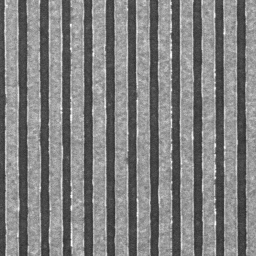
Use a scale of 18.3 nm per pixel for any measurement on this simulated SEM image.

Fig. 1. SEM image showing parallel lines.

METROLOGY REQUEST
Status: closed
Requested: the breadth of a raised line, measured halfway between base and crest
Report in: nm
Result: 229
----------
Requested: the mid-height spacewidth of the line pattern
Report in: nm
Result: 165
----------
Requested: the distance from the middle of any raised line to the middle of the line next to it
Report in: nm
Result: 400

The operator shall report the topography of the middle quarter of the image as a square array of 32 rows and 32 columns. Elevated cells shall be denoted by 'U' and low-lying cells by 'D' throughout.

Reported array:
DDUUUDDUUUDDDUUUDDUUUDDDUUUDDUUU
DDUUUDDUUUDDDUUUDDUUUDDDUUUDDUUU
DDUUUDDUUUDDDUUUDDUUUDDDUUUDDUUU
DDUUUDDUUUDDDUUUDDUUUDDDUUUDDUUU
DDUUUDDUUUDDDUUUDDUUUDDDUUUDDUUU
DDUUUDDUUUDDDUUUDDUUUDDDUUUDDUUU
DDUUUDDUUUDDDUUUDDUUUDDDUUUDDUUU
DDUUUDDUUUDDDUUUDDUUUDDDUUUDDUUU
DDUUUDDUUUDDDUUUDDUUUDDDUUUDDUUU
DDUUUDDUUUDDDUUUDDUUUDDDUUUDDUUU
DDUUUDDUUUDDDUUUDDUUUDDDUUUDDUUU
DDUUUDDUUUDDDUUUDDUUUDDDUUUDDUUU
DDUUUDDUUUDDDUUUDDUUUDDDUUUDDUUU
DDUUUDDUUUDDDUUUDDUUUDDDUUUDDUUU
DDUUUDDDUUDDDUUUDDUUUDDDUUUDDUUU
DDUUUDDDUUDDDUUUDDUUUDDDUUUDDUUU
DDUUUDDDUUDDDUUUDDUUUDDDUUUDDUUU
DDUUUDDDUUDDDUUUDDUUUDDDUUUDDUUU
DDUUUDDDUUDDDUUUDDUUUDDDUUUDDUUU
DDUUUDDDUUDDDUUUDDUUUDDDUUUDDUUU
DDUUUDDDUUDDDUUUDDUUUDDDUUUDDUUU
DDUUUDDUUUDDDUUUDDUUUDDDUUUDDUUU
DDUUUDDUUUDDDUUUDDUUUDDDUUUDDUUU
DDUUUDDDUUDDDUUUDDUUUDDDUUUDDUUU
DDUUUDDDUUDDDUUUDDUUUDDDUUUDDUUU
DDUUUDDDUUDDDUUUDDUUUDDDUUUDDUUU
DDUUUDDUUUDDDUUUDDUUUDDDUUUDDUUU
DDUUUDDUUUDDDUUUDDUUUDDDUUUDDUUU
DDUUUDDUUUDDDUUUDDUUUDDDUUUDDUUU
DDUUUDDUUUDDDUUUDDUUUDDDUUUDDUUU
DDUUUDDUUUDDDUUUDDUUUUDDUUUDDUUU
DDUUUDDUUUDDDUUUDDUUUUDDUUUDDUUU